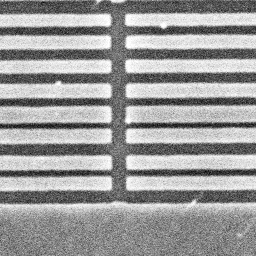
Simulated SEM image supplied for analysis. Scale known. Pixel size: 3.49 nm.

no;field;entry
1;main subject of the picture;groups of lines, slits or small figures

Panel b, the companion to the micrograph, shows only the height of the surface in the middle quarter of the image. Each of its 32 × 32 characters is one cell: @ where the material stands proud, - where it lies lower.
@@@@@@@@@@@@----@@@@@@@@@@@@@@@@
@@@@@@@@@@@@----@@@@@@@@@@@@@@@@
--------------------------------
--------------------------------
--------------------------------
@@@@@@@@@@@@----@@@@@@@@@@@@@@@@
@@@@@@@@@@@@----@@@@@@@@@@@@@@@@
@@@@@@@@@@@@----@@@@@@@@@@@@@@@@
--------------------------------
--------------------------------
--------------------------------
@@@@@@@@@@@@----@@@@@@@@@@@@@@@@
@@@@@@@@@@@@----@@@@@@@@@@@@@@@@
@@@@@@@@@@@@----@@@@@@@@@@@@@@@@
----------------@---------------
--------------------------------
---@@@@@@@@-----@@@@@@@@@@@@@@@@
@@@@@@@@@@@@----@@@@@@@@@@@@@@@@
@@@@@@@@@@@@----@@@@@@@@@@@@@@@@
@@@@@@@@@@@-----@@@@@@@@@@@@@@@@
--------------------------------
--------------------------------
--------------------------------
@@@@@@@@@@@@----@@@@@@@@@@@@@@@@
@@@@@@@@@@@@----@@@@@@@@@@@@@@@@
@@@@@@@@@@@@----@@@@@@@@@@@@@@@@
--------------------------------
--------------------------------
@@@@@@@@@@@@----@@@@@@@@--@@@@@@
@@@@@@@@@@@@----@@@@@@@@@@@@@@@@
@@@@@@@@@@@@----@@@@@@@@@@@@@@@@
--------------------------------